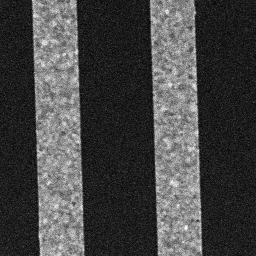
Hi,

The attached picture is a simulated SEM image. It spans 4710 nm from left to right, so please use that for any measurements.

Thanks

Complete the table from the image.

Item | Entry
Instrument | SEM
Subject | one or a few lines or trenches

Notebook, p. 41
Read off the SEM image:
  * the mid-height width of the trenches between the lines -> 1370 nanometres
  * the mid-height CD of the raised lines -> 800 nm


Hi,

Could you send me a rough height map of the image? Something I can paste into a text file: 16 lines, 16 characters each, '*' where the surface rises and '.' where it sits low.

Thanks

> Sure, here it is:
..***....***....
..***....***....
..***.....**....
..***.....**....
..***.....**....
..***.....**....
..***.....**....
..***.....**....
..***.....**....
..***.....**....
..***.....**....
..***.....**....
..***.....***...
..***.....***...
..***.....***...
...**.....***...